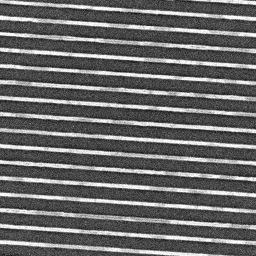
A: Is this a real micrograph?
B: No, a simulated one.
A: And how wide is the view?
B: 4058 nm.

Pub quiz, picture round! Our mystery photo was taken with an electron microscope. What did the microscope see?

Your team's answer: parallel lines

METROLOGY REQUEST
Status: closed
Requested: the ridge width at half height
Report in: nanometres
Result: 43.5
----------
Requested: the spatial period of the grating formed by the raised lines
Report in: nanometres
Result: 253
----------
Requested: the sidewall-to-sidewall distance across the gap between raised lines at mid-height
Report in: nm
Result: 213